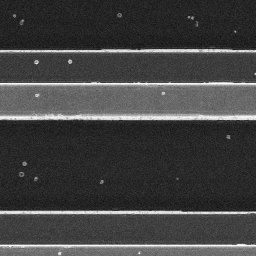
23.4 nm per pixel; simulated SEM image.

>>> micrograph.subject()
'lines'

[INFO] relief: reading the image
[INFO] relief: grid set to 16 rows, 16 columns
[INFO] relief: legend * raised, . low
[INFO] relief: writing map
................
................
................
****************
****************
****************
****************
................
................
................
................
................
................
****************
****************
****************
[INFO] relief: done